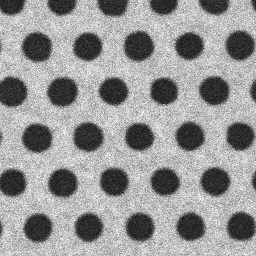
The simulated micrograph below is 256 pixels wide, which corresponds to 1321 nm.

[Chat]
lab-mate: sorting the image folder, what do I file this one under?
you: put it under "a regular array of holes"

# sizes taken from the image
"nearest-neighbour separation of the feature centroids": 262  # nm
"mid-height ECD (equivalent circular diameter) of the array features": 0.148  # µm